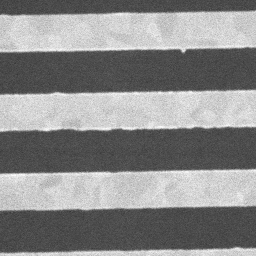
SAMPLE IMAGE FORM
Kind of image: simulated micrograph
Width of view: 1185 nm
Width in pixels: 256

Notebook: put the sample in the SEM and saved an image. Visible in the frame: one or a few lines or trenches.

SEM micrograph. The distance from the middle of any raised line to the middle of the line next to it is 367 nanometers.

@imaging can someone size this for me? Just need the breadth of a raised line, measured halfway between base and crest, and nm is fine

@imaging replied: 163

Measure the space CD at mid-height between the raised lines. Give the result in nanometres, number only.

202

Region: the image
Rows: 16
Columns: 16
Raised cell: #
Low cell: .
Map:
................
################
################
................
................
................
################
################
................
................
................
################
################
................
................
................